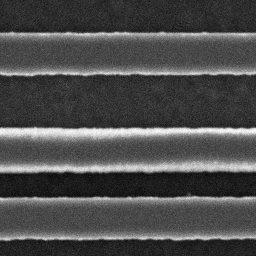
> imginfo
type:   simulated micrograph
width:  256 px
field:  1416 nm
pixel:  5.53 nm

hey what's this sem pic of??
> lines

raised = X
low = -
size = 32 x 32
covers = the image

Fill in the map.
--------------------------------
--------------------------------
--------------------------------
--------------------------------
XXXXXXXXXXXXXXXXXXXXXXXXXXXXXXXX
XXXXXXXXXXXXXXXXXXXXXXXXXXXXXXXX
XXXXXXXXXXXXXXXXXXXXXXXXXXXXXXXX
XXXXXXXXXXXXXXXXXXXXXXXXXXXXXXXX
XXXXXXXXXXXXXXXXXXXXXXXXXXXXXXXX
--------------------------------
--------------------------------
--------------------------------
--------------------------------
--------------------------------
--------------------------------
--------------------------------
XXXXXXXXXXXXXXXXXXXXXXXXXXXXXXXX
XXXXXXXXXXXXXXXXXXXXXXXXXXXXXXXX
XXXXXXXXXXXXXXXXXXXXXXXXXXXXXXXX
XXXXXXXXXXXXXXXXXXXXXXXXXXXXXXXX
XXXXXXXXXXXXXXXXXXXXXXXXXXXXXXXX
--------------------------------
--------------------------------
--------------------------------
--------------------------------
XXXXXXXXXXXXXXXXXXXXXXXXXXXXXXXX
XXXXXXXXXXXXXXXXXXXXXXXXXXXXXXXX
XXXXXXXXXXXXXXXXXXXXXXXXXXXXXXXX
XXXXXXXXXXXXXXXXXXXXXXXXXXXXXXXX
XXXXXXXXXXXXXXXXXXXXXXXXXXXXXXXX
--------------------------------
--------------------------------